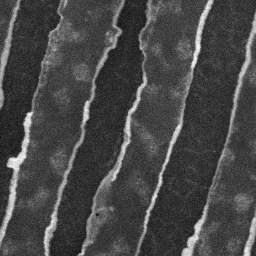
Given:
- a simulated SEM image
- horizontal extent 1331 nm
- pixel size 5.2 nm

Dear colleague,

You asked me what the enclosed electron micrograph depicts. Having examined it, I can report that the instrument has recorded one or a few lines or trenches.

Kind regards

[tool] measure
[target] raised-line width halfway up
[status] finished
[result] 283 nm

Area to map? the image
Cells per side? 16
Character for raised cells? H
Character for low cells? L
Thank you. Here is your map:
HLLLHHHHLHHHHLLL
HLLLHHHLLHHHHLLL
HLLHHHHLLHHHHLLL
LLLHHHHLLHHHLLLH
LLLHHHLLLHHHLLLH
LLHHHHLLLHHHLLLH
LLHHHHLLHHHHLLLH
LLHHHLLLHHHLLLHH
LHHHHLLLHHHLLLHH
LHHHHLLLHHHLLLHH
LHHHLLLHHHLLLLHH
LHHHLLHHHHLLLHHH
LHHHLLHHHHLLLHHH
HHHLLLHHHLLLLHHH
HHHLLLHHHLLLHHHH
HHHLLHHHHLLLHHHH